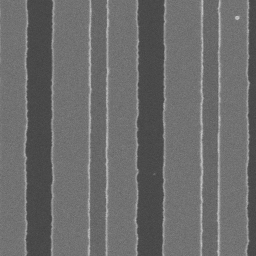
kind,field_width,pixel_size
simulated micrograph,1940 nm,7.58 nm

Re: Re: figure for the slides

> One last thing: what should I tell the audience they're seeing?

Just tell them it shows lines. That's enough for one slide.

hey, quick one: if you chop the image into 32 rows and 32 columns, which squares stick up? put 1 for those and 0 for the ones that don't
11100001111111111000011111111110
11100001111111111000011111111110
11100001111111111000011111111110
11100001111111111000011111111110
11100001111111111000011111111110
11100001111111111000011111111110
11100001111111111000011111111110
11100001111111111000011111111110
11100001111111111000011111111110
11100001111111111000011111111110
11100001111111111000011111111110
11100001111111111000011111111110
11100001111111111000011111111110
11100001111111111000111111111110
11100001111111111000111111111110
11100001111111111000111111111110
11100001111111111000111111111110
11100001111111111000111111111110
11100001111111111000011111111110
11100011111111111000111111111110
11100001111111111000111111111110
11100001111111111000111111111110
11100001111111111000111111111110
11100001111111111000111111111110
11100001111111111000111111111110
11100001111111111000111111111110
11100001111111111000111111111110
11100001111111111000111111111110
11100001111111111000111111111110
11100011111111111000111111111110
11100001111111111000111111111110
11100011111111111000111111111110